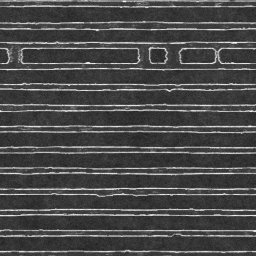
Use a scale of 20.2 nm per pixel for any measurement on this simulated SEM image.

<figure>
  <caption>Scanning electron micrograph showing parallel lines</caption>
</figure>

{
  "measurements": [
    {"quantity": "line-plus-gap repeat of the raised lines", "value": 420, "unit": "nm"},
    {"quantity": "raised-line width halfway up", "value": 0.121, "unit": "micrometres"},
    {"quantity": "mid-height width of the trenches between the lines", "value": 290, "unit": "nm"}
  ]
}